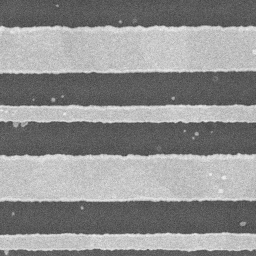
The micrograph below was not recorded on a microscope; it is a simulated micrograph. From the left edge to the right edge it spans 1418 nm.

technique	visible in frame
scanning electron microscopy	lines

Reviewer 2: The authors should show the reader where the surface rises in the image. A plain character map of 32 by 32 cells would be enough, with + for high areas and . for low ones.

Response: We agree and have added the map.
................................
................................
................................
++++++++++++++++++++++++++++++++
++++++++++++++++++++++++++++++++
++++++++++++++++++++++++++++++++
++++++++++++++++++++++++++++++++
++++++++++++++++++++++++++++++++
++++++++++++++++++++++++++++++++
................................
................................
................................
................................
++++++++++++++++++++++++++++++++
++++++++++++++++++++++++++++++++
................................
................................
................................
................................
+.++.++++.+++++.++.++++++.++++++
++++++++++++++++++++++++++++++++
++++++++++++++++++++++++++++++++
++++++++++++++++++++++++++++++++
++++++++++++++++++++++++++++++++
++++++++++++++++++++++++++++++++
................................
................................
................................
................................
++++++++++++++++++++++++++++++++
++++++++++++++++++++++++++++++++
................................